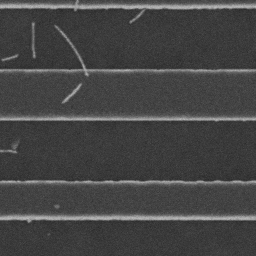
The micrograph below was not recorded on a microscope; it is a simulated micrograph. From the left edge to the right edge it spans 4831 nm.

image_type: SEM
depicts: lines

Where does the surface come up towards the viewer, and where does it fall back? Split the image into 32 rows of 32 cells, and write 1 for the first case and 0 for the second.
11111111111111111111111111111111
00000000000000000000000000000000
00000000000000000000000000000000
00000000000000000000000000000000
00000000000000000000000000000000
00000000000000000000000000000000
00000000000000000000000000000000
00000000000000000000000000000000
00000000000000000000000000000000
11111111111111111111111111111111
11111111111111111111111111111111
11111111111111111111111111111111
11111111111111111111111111111111
11111111111111111111111111111111
11111111111111111111111111111111
00000000000000000000000000000000
00000000000000000000000000000000
00000000000000000000000000000000
00000000000000000000000000000000
00000000000000000000000000000000
00000000000000000000000000000000
00000000000000000000000000000000
00000000000000000000000000000000
11111111111111111111111111111111
11111111111111111111111111111111
11111111111111111111111111111111
11111111111111111111111111111111
00000000000000000000000000000000
00000000000000000000000000000000
00000000000000000000000000000000
00000000000000000000000000000000
00000000000000000000000000000000